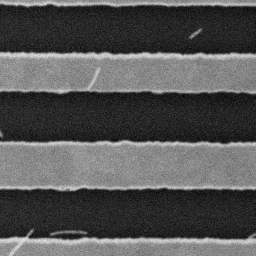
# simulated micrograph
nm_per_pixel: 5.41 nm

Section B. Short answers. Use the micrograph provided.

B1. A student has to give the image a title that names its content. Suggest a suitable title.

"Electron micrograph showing lines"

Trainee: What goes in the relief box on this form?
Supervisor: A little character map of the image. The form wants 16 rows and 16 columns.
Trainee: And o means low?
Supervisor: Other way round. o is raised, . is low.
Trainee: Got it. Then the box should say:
................
................
................
oooooooooooooooo
oooooooooooooooo
oooooooooooooooo
................
................
................
oooooooooooooooo
oooooooooooooooo
oooooooooooooooo
................
................
................
oooooooooooooooo